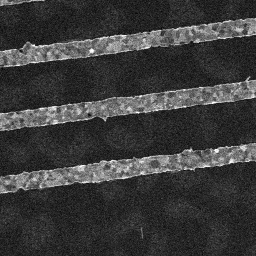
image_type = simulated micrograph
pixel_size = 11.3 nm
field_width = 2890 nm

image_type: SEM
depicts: one or a few lines or trenches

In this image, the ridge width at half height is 188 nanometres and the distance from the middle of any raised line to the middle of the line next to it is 709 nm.